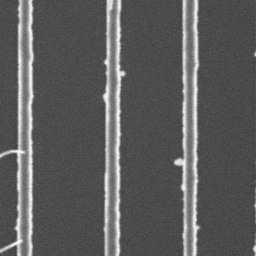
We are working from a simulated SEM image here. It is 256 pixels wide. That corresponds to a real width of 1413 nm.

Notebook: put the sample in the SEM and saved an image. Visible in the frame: lines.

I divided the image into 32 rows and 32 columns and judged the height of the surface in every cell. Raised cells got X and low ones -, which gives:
--XX---------XX--------XX-------
--XX---------XX--------XX-------
--XX---------XX--------XX-------
--XX---------XX--------XX-------
--XX---------XX--------XX-------
--XX---------XX--------XX-------
--XX---------XX--------XX-------
--XX---------XX--------XX-------
--XX---------XX--------XX-------
--XX---------XX--------XX-------
--XX---------XX--------XX-------
--XX---------XX--------XX-------
--XX---------XX--------XX-------
--XX---------XX--------XX-------
--XX---------XX--------XX-------
--XX---------XX--------XX-------
--XX---------XX--------XX-------
--XX---------XX--------XX-------
--XX---------XX--------XX-------
--XX---------XX--------XX-------
--XX---------XX--------XX-------
--XX---------XX--------XX-------
--XX---------XX--------XX-------
--XX---------XX--------XX-------
--XX---------XX--------XX-------
--XX---------XX--------XX-------
--XX---------XX--------XX-------
--XX---------XX--------X--------
--XX---------XX--------XX-------
--XX---------XX--------XX-------
--XX---------XX--------XX-------
--XX---------XX--------X--------